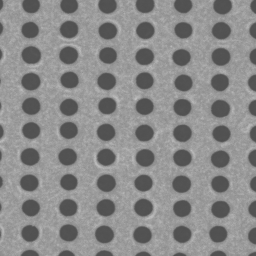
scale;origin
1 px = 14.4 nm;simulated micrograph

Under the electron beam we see a regular array of holes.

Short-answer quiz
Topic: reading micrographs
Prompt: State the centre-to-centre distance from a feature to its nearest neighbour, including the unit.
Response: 358 nanometers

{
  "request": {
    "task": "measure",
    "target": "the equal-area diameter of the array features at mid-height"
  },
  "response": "0.256 micrometres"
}